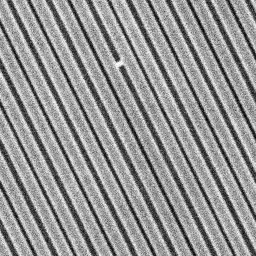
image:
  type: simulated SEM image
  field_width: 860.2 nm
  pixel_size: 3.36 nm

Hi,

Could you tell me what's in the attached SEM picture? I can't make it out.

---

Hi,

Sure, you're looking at parallel lines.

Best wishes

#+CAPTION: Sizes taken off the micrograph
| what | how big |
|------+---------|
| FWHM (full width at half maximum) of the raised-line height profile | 42.2 nm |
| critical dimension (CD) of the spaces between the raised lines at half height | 4.26 pixels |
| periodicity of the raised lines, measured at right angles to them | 0.06 microns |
